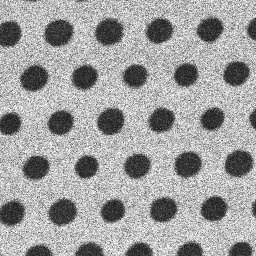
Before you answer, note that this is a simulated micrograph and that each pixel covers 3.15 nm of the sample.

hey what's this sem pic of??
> a regular array of holes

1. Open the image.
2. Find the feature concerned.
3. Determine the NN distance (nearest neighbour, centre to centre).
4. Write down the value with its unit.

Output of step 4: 159 nm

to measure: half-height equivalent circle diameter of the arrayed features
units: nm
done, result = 77.1